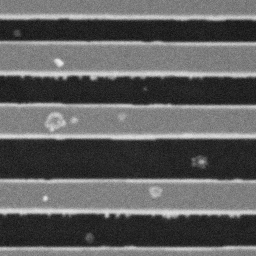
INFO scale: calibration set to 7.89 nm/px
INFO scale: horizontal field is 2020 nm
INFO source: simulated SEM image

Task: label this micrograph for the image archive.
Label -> lines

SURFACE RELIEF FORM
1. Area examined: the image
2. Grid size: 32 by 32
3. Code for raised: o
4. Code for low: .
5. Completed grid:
oooooooooooooooooooooooooooooooo
oooooooooooooooooooooooooooooooo
................................
................................
................................
oooooooooooooooooooooooooooooooo
oooooooooooooooooooooooooooooooo
oooooooooooooooooooooooooooooooo
oooooooooooooooooooooooooooooooo
................................
................................
................................
................................
oooooooooooooooooooooooooooooooo
oooooooooooooooooooooooooooooooo
oooooooooooooooooooooooooooooooo
oooooooooooooooooooooooooooooooo
................................
................................
................................
................................
................................
ooooooooooooooooooooooooooo.....
oooooooooooooooooooooooooooooooo
oooooooooooooooooooooooooooooooo
oooooooooooooooooooooooooooooooo
...........ooooooooooooooooooooo
................................
................................
................................
................................
oooooooooooooooooooooooooooooooo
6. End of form